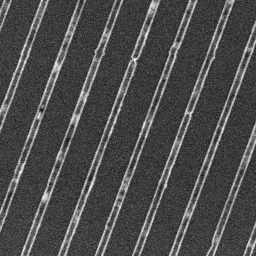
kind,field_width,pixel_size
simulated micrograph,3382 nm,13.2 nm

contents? parallel lines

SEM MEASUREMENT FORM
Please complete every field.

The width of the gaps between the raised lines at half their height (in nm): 373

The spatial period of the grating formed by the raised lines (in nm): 460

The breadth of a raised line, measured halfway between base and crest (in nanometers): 91.3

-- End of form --